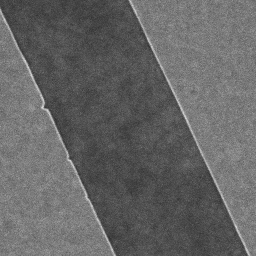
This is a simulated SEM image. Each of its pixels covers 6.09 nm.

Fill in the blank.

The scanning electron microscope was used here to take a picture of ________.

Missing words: one or a few lines or trenches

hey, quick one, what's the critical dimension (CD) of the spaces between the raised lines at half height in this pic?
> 737 nm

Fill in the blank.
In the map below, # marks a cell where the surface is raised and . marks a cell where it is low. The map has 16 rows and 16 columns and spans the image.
........########
.........#######
#........#######
#.........######
##........######
##.........#####
###........#####
###.........####
####........####
####.........###
#####........###
#####.........##
######........##
######........##
#######........#
#######........#